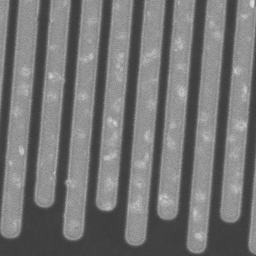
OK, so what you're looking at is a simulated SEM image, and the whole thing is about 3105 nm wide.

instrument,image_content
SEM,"parallel lines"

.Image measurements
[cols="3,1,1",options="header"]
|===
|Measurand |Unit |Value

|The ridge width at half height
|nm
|165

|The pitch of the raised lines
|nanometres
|376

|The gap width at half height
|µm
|0.216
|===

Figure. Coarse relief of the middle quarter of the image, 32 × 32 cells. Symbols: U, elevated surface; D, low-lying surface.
UUUDDDDDUUUDDDDDUUUDDDDDUUUDDDDU
UUUDDDDDUUUDDDDUUUUDDDDDUUUDDDDU
UUUDDDDDUUUDDDDUUUUDDDDUUUUDDDDU
UUUDDDDDUUUDDDDUUUUDDDDUUUDDDDDU
UUUDDDDDUUUDDDDUUUUDDDDUUUDDDDDU
UUUDDDDUUUUDDDDUUUUDDDDUUUDDDDDU
UUUDDDDUUUUDDDDUUUUDDDDUUUDDDDDU
UUUDDDDUUUUDDDDUUUDDDDDUUUDDDDDU
UUUDDDDUUUDDDDDUUUDDDDDUUUDDDDUU
UUUDDDDUUUDDDDDUUUDDDDDUUUDDDDUU
UUUDDDDUUUDDDDDUUUDDDDDUUUDDDDUU
UUUDDDDUUUDDDDDUUUDDDDDUUUDDDDUU
UUDDDDDUUUDDDDDUUUDDDDDUUUDDDDUU
UUDDDDDUUUDDDDDUUUDDDDDUUDDDDDUU
UUDDDDDUUUDDDDUUUUDDDDUUUUDDDDUU
UUDDDDDUUUDDDDUUUUDDDDUUUDDDDDUU
UUDDDDDUUUDDDDUUUUDDDDUUUDDDDDUU
UUDDDDUUUUDDDDUUUUDDDDUUUDDDDDUU
UUDDDDUUUUDDDDUUUUDDDDUUUDDDDDUU
UUDDDDUUUUDDDDUUUDDDDDUUUDDDDDUU
UUDDDDUUUDDDDDUUUDDDDDUUUDDDDUUU
UUDDDDUUUDDDDDUUUDDDDDUUUDDDDUUU
UUDDDDUUUDDDDDUUUDDDDDUUUDDDDUUU
UUDDDDUUUDDDDDUUUDDDDDUUUDDDDUUU
UDDDDDUUUDDDDDUUUDDDDDUUUDDDDUUU
UDDDDDUUUDDDDDUUUDDDDDUUDDDDDUUU
UDDDDDUUUDDDDUUUUDDDDDUUDDDDDUUU
UDDDDDUUUDDDDUUUUDDDDUUUDDDDDUUU
UDDDDDUUUDDDDUUUUDDDDUUUDDDDDUUU
UDDDDDUUUDDDDUUUUDDDDUUUDDDDDUUU
UDDDDDUUUDDDDUUUUDDDDUUUDDDDDUUU
UDDDDDUUUDDDDUUUDDDDDUUUDDDDDUUU